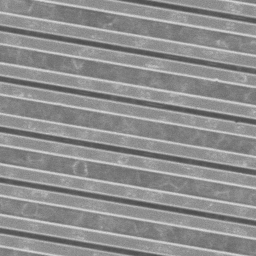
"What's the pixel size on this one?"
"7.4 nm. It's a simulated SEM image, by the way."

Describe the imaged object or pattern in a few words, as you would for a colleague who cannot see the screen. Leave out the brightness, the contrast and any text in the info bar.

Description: parallel lines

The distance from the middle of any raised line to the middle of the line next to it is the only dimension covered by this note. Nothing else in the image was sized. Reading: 184 nm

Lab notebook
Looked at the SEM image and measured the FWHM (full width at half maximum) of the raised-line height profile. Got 94.9 nanometers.